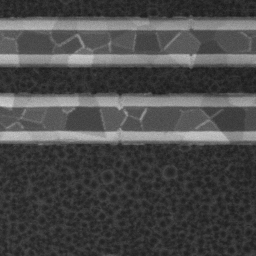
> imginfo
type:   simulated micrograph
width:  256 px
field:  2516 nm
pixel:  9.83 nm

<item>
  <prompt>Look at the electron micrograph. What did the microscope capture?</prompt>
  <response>one or a few lines or trenches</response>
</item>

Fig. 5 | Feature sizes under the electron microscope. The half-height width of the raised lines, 33.4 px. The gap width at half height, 423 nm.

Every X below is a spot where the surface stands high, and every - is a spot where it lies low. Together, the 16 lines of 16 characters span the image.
----------------
----------------
XXXXXXXXXXXXXXXX
XXXXXXXXXXXXXXXX
----------------
----------------
XXXXXXXXXXXXXXXX
XXXXXXXXXXXXXXXX
----------------
----------------
----------------
----------------
----------------
----------------
----------------
----------------